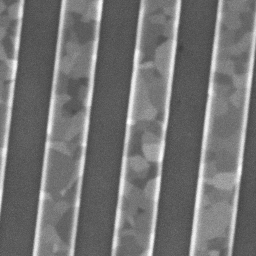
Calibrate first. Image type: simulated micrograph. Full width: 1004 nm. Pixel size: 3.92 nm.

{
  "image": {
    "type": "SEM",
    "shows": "one or a few lines or trenches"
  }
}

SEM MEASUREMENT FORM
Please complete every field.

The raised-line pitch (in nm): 307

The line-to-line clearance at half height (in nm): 159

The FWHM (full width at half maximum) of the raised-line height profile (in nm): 148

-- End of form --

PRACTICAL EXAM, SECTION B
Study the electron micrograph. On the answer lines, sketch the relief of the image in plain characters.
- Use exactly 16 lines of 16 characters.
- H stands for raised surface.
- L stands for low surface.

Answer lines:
HLLLHHLLLHHLLLHH
HLLLHHLLLHHLLLHH
HLLLHHLLLHHLLLHH
HLLLHHLLLHHLLHHH
HLLHHHLLHHHLLHHH
HLLHHHLLHHHLLHHH
HLLHHHLLHHHLLHHL
HLLHHLLLHHLLLHHL
LLLHHLLLHHLLLHHL
LLLHHLLLHHLLLHHL
LLLHHLLLHHLLLHHL
LLLHHLLLHHLLHHHL
LLLHHLLLHHLLHHHL
LLHHHLLHHHLLHHHL
LLHHHLLHHHLLHHHL
LLHHHLLHHLLLHHLL